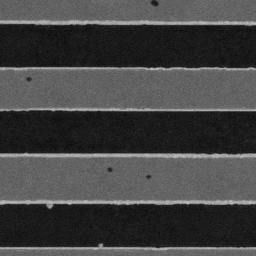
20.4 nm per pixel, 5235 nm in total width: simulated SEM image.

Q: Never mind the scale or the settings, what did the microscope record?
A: lines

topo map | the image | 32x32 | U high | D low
UUUUUUUUUUUUUUUUUUUUUUUUUUUUUUUU
UUUUUUUUUUUUUUUUUUUUUUUUUUUUUUUU
UUUUUUUUUUUUUUUUUUUUUUUUUUUUUUUU
DDDDDDDDDDDDDDDDDDDDDDDDDDDDDDDD
DDDDDDDDDDDDDDDDDDDDDDDDDDDDDDDD
DDDDDDDDDDDDDDDDDDDDDDDDDDDDDDDD
DDDDDDDDDDDDDDDDDDDDDDDDDDDDDDDD
DDDDDDDDDDDDDDDDDDDDDDDDDDDDDDDD
UUDUUUUUUUUUUUUUUUUDDDUDDUDDDDDD
UUUUUUUUUUUUUUUUUUUUUUUUUUUUUUUU
UUUUUUUUUUUUUUUUUUUUUUUUUUUUUUUU
UUUUUUUUUUUUUUUUUUUUUUUUUUUUUUUU
UUUUUUUUUUUUUUUUUUUUUUUUUUUUUUUU
UUUUUUUUUUUUUUUUUUUUUUUUUUUUUUUU
DDDDDDDDDDDDDDDDDDDDDDDDDDDDDDDD
DDDDDDDDDDDDDDDDDDDDDDDDDDDDDDDD
DDDDDDDDDDDDDDDDDDDDDDDDDDDDDDDD
DDDDDDDDDDDDDDDDDDDDDDDDDDDDDDDD
DDDDDDDDDDDDDDDDDDDDDDDDDDDDDDDD
UUUUUUUUUUUUUUUUUUUUUUUUUUUUUUUU
UUUUUUUUUUUUUUUUUUUUUUUUUUUUUUUU
UUUUUUUUUUUUUUUUUUUUUUUUUUUUUUUU
UUUUUUUUUUUUUUUUUUUUUUUUUUUUUUUU
UUUUUUUUUUUUUUUUUUUUUUUUUUUUUUUU
UUUUUUUUUUUUUUUUUUUUUUUUUUUUUUUU
DDDDDDDDDDDDDDDDDDDDDDDDDDDDDDDD
DDDDDDDDDDDDDDDDDDDDDDDDDDDDDDDD
DDDDDDDDDDDDDDDDDDDDDDDDDDDDDDDD
DDDDDDDDDDDDDDDDDDDDDDDDDDDDDDDD
DDDDDDDDDDDDDDDDDDDDDDDDDDDDDDDD
DDDDDDDDDDDDDDDDDDDDDDDDDDDDDDDD
UUUUUUUUUUUUUUUUUUUUUUUUUUUUUUUU